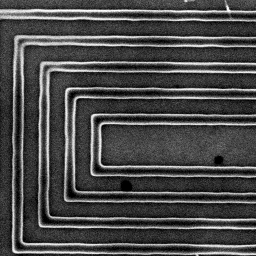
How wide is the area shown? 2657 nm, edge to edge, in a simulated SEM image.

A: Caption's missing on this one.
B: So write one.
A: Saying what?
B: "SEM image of groups of lines, slits or small figures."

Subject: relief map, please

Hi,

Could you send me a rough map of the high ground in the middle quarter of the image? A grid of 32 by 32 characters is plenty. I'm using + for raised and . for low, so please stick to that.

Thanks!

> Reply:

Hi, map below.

++++++++++++++++++++++++++++++++
++++++++++++++++++++++++++++++++
................................
................................
................................
................................
.+++++++++++++++++++++++++++++++
++++++++++++++++++++++++++++++++
+++.............................
+++.............................
+++.............................
.++.............................
.++.............................
.+.....+++++++++++++++++++++++++
.+.....+++++++++++++++++++++++++
++.....++.......................
++.....++.......................
++.....++.......................
.+.....++.......................
.+.....++.......................
.+.....++.......................
.+.....++.......................
++.....++.......................
++.....++.......................
++.....++.......................
+++....+++......................
+++....+++++++++++++++++++++++++
+++....+++++++++++++++++++++++++
+++.............................
+++.............................
+++.............................
+++.............................